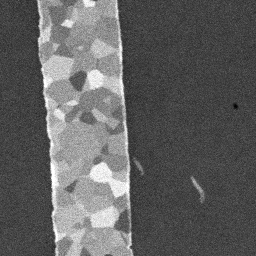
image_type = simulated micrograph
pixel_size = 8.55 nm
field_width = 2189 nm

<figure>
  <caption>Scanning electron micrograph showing one or a few lines or trenches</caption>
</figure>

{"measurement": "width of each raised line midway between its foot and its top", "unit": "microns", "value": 0.662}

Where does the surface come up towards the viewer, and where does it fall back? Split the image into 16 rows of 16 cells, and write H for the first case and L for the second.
LLHHHHHLLLLLLLLL
LLLHHHHLLLLLLLLL
LLHHHHHHLLLLLLLL
LLHHHHHHLLLLLLLL
LLLHHHHHLLLLLLLL
LLLHHHHHLLLLLLLL
LLLHHHHHLLLLLLLL
LLLHHHHHLLLLLLLL
LLLHHHHHLLLLLLLL
LLLHHHHHLLLLLLLL
LLLHHHHHLLLLLLLL
LLLHHHHHLLLLLLLL
LLLHHHHHLLLLLLLL
LLLHHHHHLLLLLLLL
LLLHHHHHLLLLLLLL
LLLLHHHHLLLLLLLL